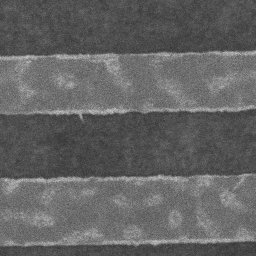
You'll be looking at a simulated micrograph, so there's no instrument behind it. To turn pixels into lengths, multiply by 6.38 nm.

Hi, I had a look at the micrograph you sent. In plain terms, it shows one or a few lines or trenches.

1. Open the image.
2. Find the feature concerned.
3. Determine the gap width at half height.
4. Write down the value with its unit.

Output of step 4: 0.408 um